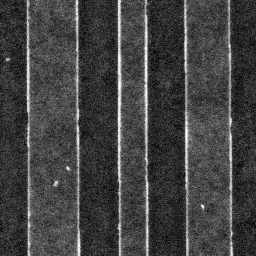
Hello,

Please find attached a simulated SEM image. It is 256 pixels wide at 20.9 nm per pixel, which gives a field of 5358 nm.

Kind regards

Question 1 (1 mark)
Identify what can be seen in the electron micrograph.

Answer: lines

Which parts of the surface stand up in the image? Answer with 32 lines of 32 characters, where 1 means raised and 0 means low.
00011111110000011100000111111000
00011111110000011100000111111000
00011111110000011100000111111000
00011111110000011100000111111000
00011111110000011100000111111000
00011111110000011100000111111000
00011111110000011100000111111000
00011111110000011100000111111000
00011111110000011100000111111000
00011111110000011100000111111000
00011111110000011100000111111000
00011111110000011100000111111000
00011111110000011100000111111000
00011111110000011100000111111000
00001111110000011100000111111000
00001111110000011100000111111000
00011111110000011100000111111000
00011111110000011100000111111000
00011111110000011100000111111000
00001111110000011100000111111000
00001111110000011100000111111000
00001111110000011100000111111000
00001111110000011100000111111000
00001111110000011100000111111000
00001111110000011100000111111000
00001111110000011100000111111000
00001111110000011100000111111000
00001111110000011100000111111000
00001111110000011100000111111000
00001111110000011100000111111000
00001111110000011100000111111000
00001111110000011100000111111000